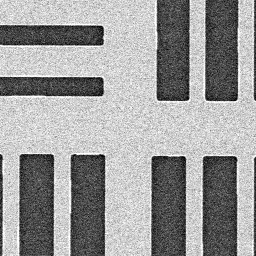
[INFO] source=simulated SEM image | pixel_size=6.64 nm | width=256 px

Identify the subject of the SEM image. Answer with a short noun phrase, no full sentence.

groups of lines, slits or small figures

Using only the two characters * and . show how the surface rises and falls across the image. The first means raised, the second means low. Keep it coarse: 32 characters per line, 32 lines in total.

*******************.....**....**
*******************.....**....**
*******************.....**....**
.............******.....**....**
.............******.....**....**
.............******.....**....**
*******************.....**....**
*******************.....**....**
*******************.....**....**
*******************.....**....**
.............******.....**....**
.............******.....**....**
********************....**....**
********************************
********************************
********************************
********************************
********************************
********************************
***....**....******....***...***
**.....**....******....**.....**
**.....**....******....**.....**
**.....**....******....**.....**
**.....**....******....**.....**
**.....**....******....**.....**
**.....**....******....**.....**
**.....**....******....**.....**
**.....**....******....**.....**
**.....**....******....**.....**
**.....**....******....**.....**
**.....**....******....**.....**
**.....**....******....**.....**